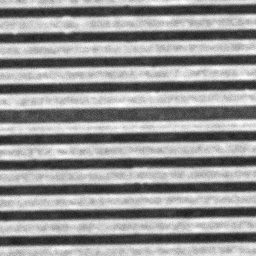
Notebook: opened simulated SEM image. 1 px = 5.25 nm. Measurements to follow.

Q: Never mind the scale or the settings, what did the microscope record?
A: parallel lines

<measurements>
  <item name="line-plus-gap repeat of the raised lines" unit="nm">133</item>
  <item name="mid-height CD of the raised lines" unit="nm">72.2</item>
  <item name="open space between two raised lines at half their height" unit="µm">0.0578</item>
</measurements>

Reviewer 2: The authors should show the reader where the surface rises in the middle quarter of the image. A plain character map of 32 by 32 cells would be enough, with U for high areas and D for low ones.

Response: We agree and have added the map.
DDDDDDDDDDDDDDDDDDDDDDDDDDDDDDDD
UUUUUUUUUUUUUUUUUUUUUUUUUUUUUUUU
UUUUUUUUUUUUUUUUUUUUUUUUUUUUUUUU
UUUUUUUUUUUUUUUUUUUUUUUUUUUUUUUU
UUUUUDDDDDDDDDDDDDDDDDDDDDDDDDDD
DDDDDDDDDDDDDDDDDDDDDDDDDDDDDDDD
DDDDDDDDDDDDDDDDDDDDDDDDDDDDDDDD
DDDUUUUUUUUUUUUUUUUUUUUUUUUUUUUU
UUUUUUUUUUUUUUUUUUUUUUUUUUUUUUUU
UUUUUUUUUUUUUUUUUUUUUUUUUUUUUUUU
UUUUUUUUUUUUUUDDUUUUUUUUUUUUUDDD
DDDDDDDDDDDDDDDDDDDDDDDDDDDDDDDD
DDDDDDDDDDDDDDDDDDDDDDDDDDDDDDDD
DDDDDDDDDDDDDDDDDDDDDDDDDDDDDDDD
DDDDDDDDDDDDDDDDDDDDDDDDDDDDDDDD
UUUUUUUUUUUUUUUUUUUUUUUUUUUUUUUU
UUUUUUUUUUUUUUUUUUUUUUUUUUUUUUUU
DDDDDDDDDDDDDDDDDDDDDDDDDDDDDDDD
DDDDDDDDDDDDDDDDDDDDDDDDDDDDDDDD
DDDDDDDDDDDDDDDDDDDDDDDDDDDDDDDD
UUUUUUUUUUUUUUUUUUUUUUUUUUUUUUUU
UUUUUUUUUUUUUUUUUUUUUUUUUUUUUUUU
UUUUUUUUUUUUUUUUUUUUUUUUUUUUUUUU
DDDUUUDDDDDDDDDDDDDDDDDDDDDDDDDD
DDDDDDDDDDDDDDDDDDDDDDDDDDDDDDDD
DDDDDDDDDDDDDDDDDDDDDDDDDDDDDDDD
DDDDDDDDDDDDUUUUUUUUUUUUUUUUUUUU
UUUUUUUUUUUUUUUUUUUUUUUUUUUUUUUU
UUUUUUUUUUUUUUUUUUUUUUUUUUUUUUUU
UUUUUUUUUUUUUUUUUUDUUUUDDDDDDDDD
DDDDDDDDDDDDDDDDDDDDDDDDDDDDDDDD
DDDDDDDDDDDDDDDDDDDDDDDDDDDDDDDD